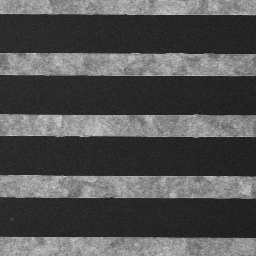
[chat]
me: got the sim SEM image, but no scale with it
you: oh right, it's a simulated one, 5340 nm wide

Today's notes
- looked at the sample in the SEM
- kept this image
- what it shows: one or a few lines or trenches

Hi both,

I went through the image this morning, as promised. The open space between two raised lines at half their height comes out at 826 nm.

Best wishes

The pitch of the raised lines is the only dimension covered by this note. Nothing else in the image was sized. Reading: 61.2 px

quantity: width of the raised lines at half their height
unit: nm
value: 454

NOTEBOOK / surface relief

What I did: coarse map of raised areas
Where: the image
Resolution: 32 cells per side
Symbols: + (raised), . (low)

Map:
++++++++++++++++++++++++++++++++
++++++++++++++++++++++++++++++++
................................
................................
................................
................................
................................
++++++++++++++++++++++++++++++++
++++++++++++++++++++++++++++++++
................................
................................
................................
................................
................................
++++++++++++++++++++++++++++....
++++++++++++++++++++++++++++++++
++++++++++++++++++++++++++++++++
................................
................................
................................
................................
................................
++++++++++++++++++++++++++++++++
++++++++++++++++++++++++++++++++
++++++++++++++++++++++++++++++++
................................
................................
................................
................................
................................
++++++++++++++++++++++++++++++++
++++++++++++++++++++++++++++++++